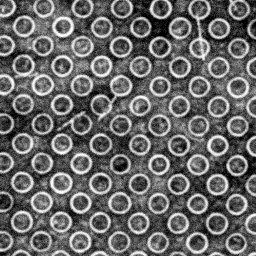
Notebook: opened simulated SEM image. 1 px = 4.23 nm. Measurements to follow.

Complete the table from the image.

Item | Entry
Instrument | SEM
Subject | a regular array of raised bodies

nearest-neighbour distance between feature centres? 116 nm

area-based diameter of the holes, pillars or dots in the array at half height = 0.0811 micrometres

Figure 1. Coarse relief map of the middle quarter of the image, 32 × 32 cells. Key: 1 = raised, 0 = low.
11000001111100000111110000011110
11000001111000000111100000011110
10000000111000000011100000011110
00011100000001110000000100000000
00111110000011110000001111000000
00111110000011111000001111000000
00111110000011110000001111000000
00011100000001100000000110000000
10000000111000000011000000001100
11000001111100000111100000011110
11000001111100000111100000011110
10000001111000000111100000011110
00001000010000000011000000011100
00111100000001110000001110000000
00111110000011110000001111000000
00111110000011111000011111000001
00111100000011110000001111000000
00000000000001100000000110000000
10000001111000000011100000011100
11000001111100000111100000111110
11000001111100000111100000111110
10000001111000000111100000011110
00000000000000000000000000001100
00011100000011110000001110000000
00111110000011110000001111000001
00111110000011110000011111000001
00011100000011110000001111000000
00000000000000000000000000000000
10000001111000000111100000011100
11000001111100000111100000111110
11000001111000000111100000111110
10000001111000000111100000011110